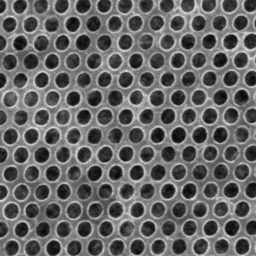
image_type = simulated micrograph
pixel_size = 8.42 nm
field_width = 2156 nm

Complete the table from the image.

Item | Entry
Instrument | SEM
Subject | a regular array of holes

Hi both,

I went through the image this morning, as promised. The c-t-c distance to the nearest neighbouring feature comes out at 175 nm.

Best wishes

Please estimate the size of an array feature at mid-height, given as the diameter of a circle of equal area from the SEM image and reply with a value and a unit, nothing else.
130 nm